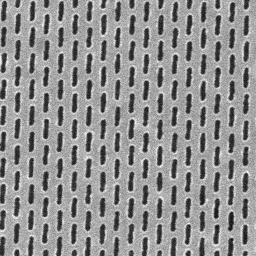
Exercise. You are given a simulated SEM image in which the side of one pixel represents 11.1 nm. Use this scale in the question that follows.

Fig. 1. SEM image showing a regular array of holes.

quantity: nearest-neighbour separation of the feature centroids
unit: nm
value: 212